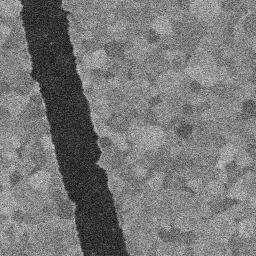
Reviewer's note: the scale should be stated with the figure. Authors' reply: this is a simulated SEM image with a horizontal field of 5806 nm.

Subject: one or a few lines or trenches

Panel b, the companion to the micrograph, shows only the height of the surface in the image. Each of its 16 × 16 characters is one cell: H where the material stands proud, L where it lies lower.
HLLLHHHHHHHHHHHH
HLLLHHHHHHHHHHHH
HHLLHHHHHHHHHHHH
HHLLLHHHHHHHHHHH
HHLLLHHHHHHHHHHH
HHLLLHHHHHHHHHHH
HHHLLLHHHHHHHHHH
HHHLLLHHHHHHHHHH
HHHLLLHHHHHHHHHH
HHHLLLHHHHHHHHHH
HHHHLLHHHHHHHHHH
HHHHLLLHHHHHHHHH
HHHHLLLHHHHHHHHH
HHHHHLLHHHHHHHHH
HHHHHLLLHHHHHHHH
HHHHHLLLHHHHHHHH